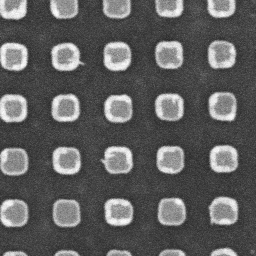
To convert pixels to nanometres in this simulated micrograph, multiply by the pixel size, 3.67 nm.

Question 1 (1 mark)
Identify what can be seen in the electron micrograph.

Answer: a regular array of raised bodies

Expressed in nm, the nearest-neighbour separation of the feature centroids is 190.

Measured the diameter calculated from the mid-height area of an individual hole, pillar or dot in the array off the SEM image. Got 102 nanometres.